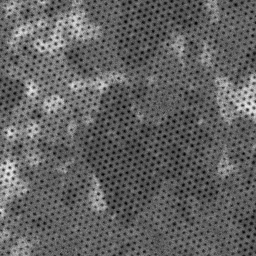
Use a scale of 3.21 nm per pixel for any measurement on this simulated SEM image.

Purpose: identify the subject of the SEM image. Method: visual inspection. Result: a regular array of holes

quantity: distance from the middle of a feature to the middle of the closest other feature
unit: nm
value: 20.4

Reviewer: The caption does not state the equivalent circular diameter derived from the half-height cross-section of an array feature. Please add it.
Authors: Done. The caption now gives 8.1 nanometres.